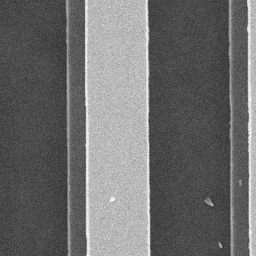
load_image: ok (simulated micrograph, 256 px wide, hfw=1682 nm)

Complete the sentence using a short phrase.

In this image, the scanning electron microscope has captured lines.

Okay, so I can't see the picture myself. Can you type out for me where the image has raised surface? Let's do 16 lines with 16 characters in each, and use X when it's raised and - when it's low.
-----XXXX------X
-----XXXX------X
-----XXXX-------
-----XXXX-------
-----XXXX-------
-----XXXX-------
-----XXXX-------
-----XXXX-------
-----XXXX-------
-----XXXX-------
-----XXXX-------
-----XXXX-------
-----XXXX-------
-----XXXX-------
-----XXXX-------
-----XXXX-------